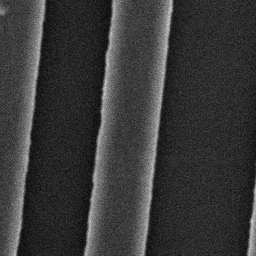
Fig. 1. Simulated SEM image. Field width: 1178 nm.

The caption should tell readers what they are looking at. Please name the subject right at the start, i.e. lines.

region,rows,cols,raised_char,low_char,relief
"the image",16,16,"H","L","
HHHLLLLHHHHLLLLL
HHHLLLLHHHHLLLLL
HHHLLLLHHHHLLLLL
HHLLLLLHHHLLLLLL
HHLLLLLHHHLLLLLL
HHLLLLHHHHLLLLLL
HHLLLLHHHHLLLLLL
HHLLLLHHHHLLLLLL
HHLLLLHHHHLLLLLL
HHLLLLHHHHLLLLLL
HHLLLLHHHHLLLLLL
HHLLLLHHHHLLLLLL
HLLLLLHHHLLLLLLL
HLLLLLHHHLLLLLLL
HLLLLHHHHLLLLLLL
HLLLLHHHHLLLLLLL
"